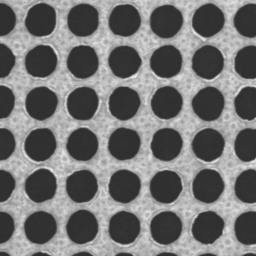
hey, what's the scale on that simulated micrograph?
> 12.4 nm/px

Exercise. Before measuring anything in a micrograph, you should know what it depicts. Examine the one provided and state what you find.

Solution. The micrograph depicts a regular array of holes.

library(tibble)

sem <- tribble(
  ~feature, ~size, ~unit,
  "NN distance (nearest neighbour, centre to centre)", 513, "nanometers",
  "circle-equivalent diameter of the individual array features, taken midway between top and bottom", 408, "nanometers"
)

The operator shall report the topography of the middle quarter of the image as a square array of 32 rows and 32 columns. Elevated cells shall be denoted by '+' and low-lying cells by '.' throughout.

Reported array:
+........++........+++.......+++
+.......++++.......+++.......+++
++.....+++++......+++++.....++++
+++...++++++++..++++++++++++++++
++++++++++++++++++++++++++++++++
++++++++++++++.+++++++++++++++++
++.....++++++....++++++.....++++
+.......++++.......+++.......+++
+........++........+++........++
+........++........+++........++
+........++........+++........++
+.......+++........+++.......+++
+.......++++......+++++......+++
++.....++++++....+++++++...+++++
++++++++++++++++++++++++++++++++
++++++++++++++++++++++++++++++++
+++....++++++....+++++++....++++
+.......++++......+++++......+++
+.......+++........+++.......+++
+........++........+++........++
.........++........++.........++
+.......+++........+++.......+++
+.......++++......++++.......+++
++.....++++++....++++++.....++++
++++++++++++++++++++++++++++++++
++++++++++++++++++++++++++++++++
++++..++++++++..+++++++++.++++++
++.....+++++......+++++.....++++
+.......++++.......+++.......+++
........+++........++........+++
........+++........++.........++
+.......+++........++.........++